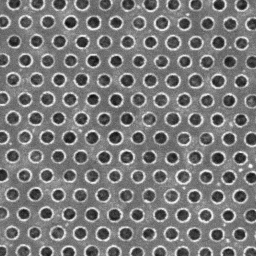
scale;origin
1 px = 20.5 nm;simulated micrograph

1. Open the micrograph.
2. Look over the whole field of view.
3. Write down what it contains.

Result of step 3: a regular array of holes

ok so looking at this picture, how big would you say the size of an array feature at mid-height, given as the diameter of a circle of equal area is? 254 nm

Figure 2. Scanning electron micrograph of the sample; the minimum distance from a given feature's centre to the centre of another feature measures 449 nanometres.